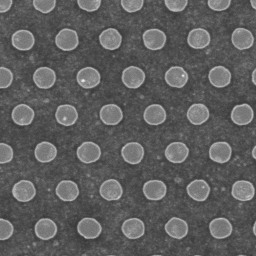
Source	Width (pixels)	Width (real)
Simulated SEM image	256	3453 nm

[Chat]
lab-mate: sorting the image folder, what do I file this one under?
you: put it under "a regular array of raised bodies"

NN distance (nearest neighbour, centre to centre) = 584 nanometres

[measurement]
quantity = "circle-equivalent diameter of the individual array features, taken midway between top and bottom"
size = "292 nm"